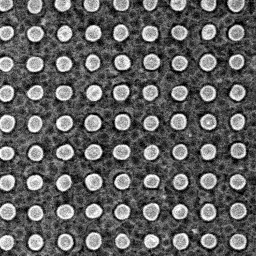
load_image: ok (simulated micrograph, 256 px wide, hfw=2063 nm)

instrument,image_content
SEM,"a regular array of raised bodies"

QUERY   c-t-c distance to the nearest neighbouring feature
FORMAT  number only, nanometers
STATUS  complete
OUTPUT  229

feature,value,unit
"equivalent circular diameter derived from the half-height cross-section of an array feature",15.1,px